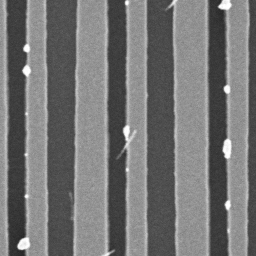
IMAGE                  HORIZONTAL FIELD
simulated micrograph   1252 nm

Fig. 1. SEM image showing lines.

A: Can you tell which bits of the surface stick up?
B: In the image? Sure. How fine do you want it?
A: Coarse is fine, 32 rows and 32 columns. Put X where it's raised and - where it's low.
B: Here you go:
X--XXX----XXX---XX----XXXX--XXX-
X--XXX----XXX---XX----XXXX--XXX-
X--XXX----XXX---XX----XXXX--XXX-
X--XXX----XXXX--XX----XXXX--XXX-
X--XXX----XXXX--XX----XXXX--XXX-
X--XXX----XXX---XX----XXXX--XXX-
X--XXX----XXX---XX----XXXX--XXX-
X--XXX----XXX---XX----XXXX--XXX-
X--XXX---XXXX---XX----XXXX--XXX-
X--XXX---XXXX---XX----XXXX--XXX-
X--XXX---XXXX---XX----XXXX--XXX-
X--XXX---XXXX---XX----XXXX--XXX-
X--XXX---XXXX---XX----XXXX--XXX-
X--XXX---XXXX---XX----XXXX--XXX-
X--XXX---XXXX---XX----XXXX--XXX-
X--XXX---XXXX---XX----XXXX--XXX-
X--XXX---XXXX--XXX----XXXX--XXX-
X--XXX---XXXXX--XX----XXXX--XXX-
X--XXX---XXXXX--XX----XXXX--XXX-
X--XXX---XXXXX--XX----XXXX--XXX-
X--XXX---XXXX---XX----XXXX--XXX-
X--XXX---XXXX---XX----XXXX--XXX-
X--XXX---XXXX---XX----XXXX--XXX-
X--XXX---XXXX---XX----XXXX--XXX-
X--XXX---XXXX---XX----XXXX--XXX-
X--XXX---XXXX---XX----XXXX--XXX-
X--XXX---XXXX---XX----XXXX--XXX-
X--XXX---XXXXX--XX----XXXX---XX-
X--XXX---XXXXX--XX----XXXX---XX-
X--XXX---XXXXX--XX----XXXX---XX-
X-XXXX---XXXXX--XX----XXXX---XX-
X--XXX---XXXXX--XX----XXXX---XX-